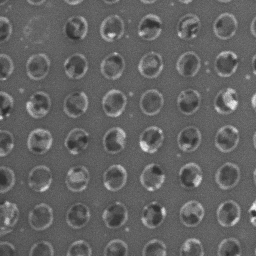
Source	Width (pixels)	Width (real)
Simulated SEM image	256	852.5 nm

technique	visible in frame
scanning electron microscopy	a regular array of raised bodies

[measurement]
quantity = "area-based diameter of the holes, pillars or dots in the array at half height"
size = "76.9 nanometers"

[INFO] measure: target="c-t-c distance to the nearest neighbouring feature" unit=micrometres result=0.123